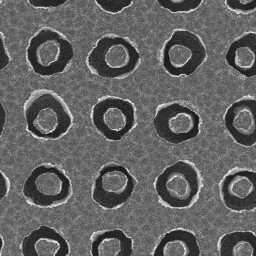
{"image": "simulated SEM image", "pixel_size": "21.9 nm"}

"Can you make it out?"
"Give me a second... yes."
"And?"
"a regular array of ring-shaped grooves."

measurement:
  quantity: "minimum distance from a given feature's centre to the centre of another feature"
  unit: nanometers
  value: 1350